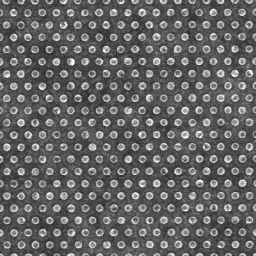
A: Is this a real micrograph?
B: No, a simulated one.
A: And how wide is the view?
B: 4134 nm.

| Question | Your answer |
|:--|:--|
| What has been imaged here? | a regular array of raised bodies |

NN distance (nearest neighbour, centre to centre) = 223 nm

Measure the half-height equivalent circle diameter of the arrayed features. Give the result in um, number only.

0.109